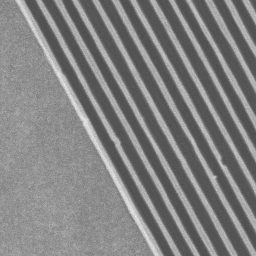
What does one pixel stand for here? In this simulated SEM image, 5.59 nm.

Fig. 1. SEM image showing parallel lines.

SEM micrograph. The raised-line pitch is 92.1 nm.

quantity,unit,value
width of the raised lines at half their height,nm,37.5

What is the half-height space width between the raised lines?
53.5 nanometers